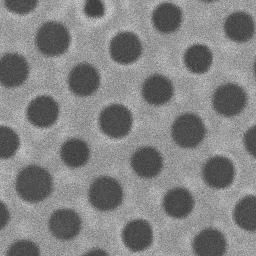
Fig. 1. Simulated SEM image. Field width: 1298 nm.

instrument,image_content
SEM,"a regular array of holes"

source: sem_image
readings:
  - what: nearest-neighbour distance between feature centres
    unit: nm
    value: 260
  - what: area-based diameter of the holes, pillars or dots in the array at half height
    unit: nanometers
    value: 172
